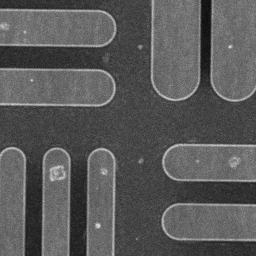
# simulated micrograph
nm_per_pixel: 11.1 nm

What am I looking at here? groups of lines, slits or small figures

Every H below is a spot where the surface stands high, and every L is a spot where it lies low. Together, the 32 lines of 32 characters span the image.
LLLLLLLLLLLLLLLLLLLHHHHHHLLHHHHH
HHHHHHHHHHHHHLLLLLLHHHHHHLHHHHHH
HHHHHHHHHHHHHHLLLLLHHHHHHLHHHHHH
HHHHHHHHHHHHHHLLLLLHHHHHHLHHHHHH
HHHHHHHHHHHHHHLLLLLHHHHHHLHHHHHH
HHHHHHHHHHHHHLLLLLLHHHHHHLHHHHHH
LLLLLLLLLLLLLLLLLLLHHHHHHLHHHHHH
LLLLLLLLLLLLLLLLLLLHHHHHHLHHHHHH
LLLLLLLLLLLLLLLLLLLHHHHHHLHHHHHH
HHHHHHHHHHHHHHLLLLLHHHHHHLHHHHHH
HHHHHHHHHHHHHHLLLLLHHHHHHLHHHHHH
HHHHHHHHHHHHHHLLLLLLHHHHLLLHHHHH
HHHHHHHHHHHHHHLLLLLLLLLLLLLLLHLL
LLLLLLLLLLLLLLLLLLLLLLLLLLLLLLLL
LLLLLLLLLLLLLLLLLLLLLLLLLLLLLLLL
LLLLLLLLLLLLLLLLLLLLLLLLLLLLLLLL
LLLLLLLLLLLLLLLLLLLLLLLLLLLLLLLL
LLLLLLLLLLLLLLLLLLLLLLLLLLLLLLLL
LHLLLLLLLLLLLLLLLLLLLHHHHHHHHHHH
HHHLLLHHHLLHHHLLLLLLLHHHHHHHHHHH
HHHLLLHHHLLHHHLLLLLLHHHHHHHHHHHH
HHHLLHHHHLLHHHLLLLLLLHHHHHHHHHHH
HHHLLHHHHLLHHHLLLLLLLLHHHHHHHHHH
HHHLLHHHHLLHHHLLLLLLLLLLLLLLLLLL
HHHLLHHHHLLHHHLLLLLLLLLLLLLLLLLL
HHHLLHHHHLLHHHLLLLLLLLLLLLLLLLLL
HHHLLHHHHLLHHHLLLLLLLHHHHHHHHHHH
HHHLLHHHHLLHHHLLLLLLHHHHHHHHHHHH
HHHLLHHHHLLHHHLLLLLLHHHHHHHHHHHH
HHHLLHHHHLLHHHLLLLLLLHHHHHHHHHHH
HHHLLHHHHLLHHHLLLLLLLLLLLLLLLLLL
HHHLLHHHHLLHHHLLLLLLLLLLLLLLLLLL